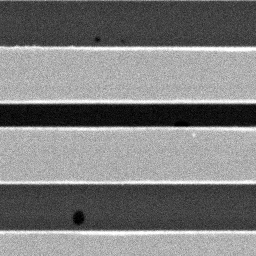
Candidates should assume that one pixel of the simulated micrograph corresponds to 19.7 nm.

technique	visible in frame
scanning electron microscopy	lines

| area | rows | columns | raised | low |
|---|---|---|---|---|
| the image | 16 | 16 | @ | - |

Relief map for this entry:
----------------
----------------
----------------
@@@@@@@@@@@@@@@@
@@@@@@@@@@@@@@@@
@@@@@@@@@@@@@@@@
----------------
----------------
@@@@@@@@@@@@@@@@
@@@@@@@@@@@@@@@@
@@@@@@@@@@@@@@@@
----------------
----------------
----------------
@@@@@@@@@@@@@@@@
@@@@@@@@@@@@@@@@